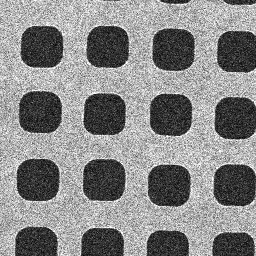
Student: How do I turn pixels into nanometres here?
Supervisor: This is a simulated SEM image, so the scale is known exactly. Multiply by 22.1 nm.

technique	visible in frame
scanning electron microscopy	a regular array of holes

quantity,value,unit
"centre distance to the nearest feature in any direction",1440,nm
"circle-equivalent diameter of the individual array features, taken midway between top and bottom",999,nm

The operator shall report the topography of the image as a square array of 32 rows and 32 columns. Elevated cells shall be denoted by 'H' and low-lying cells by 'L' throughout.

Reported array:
HHHHHHHHHHHHHHHHHHHHHLLHHHHHHLLL
HHHHHHHHHHHHHHHHHHHHHHHHHHHHHHHH
HHHHHHHHHHHHHHHHHHHHHHHHHHHHHHHH
HHHHLLLHHHHHLLLHHHHHHHHHHHHHHHHH
HHHLLLLLHHHLLLLLHHHLLLLLHHHHLLLL
HHLLLLLLHHHLLLLLHHHLLLLLHHHLLLLL
HHHLLLLLHHHLLLLLHHHLLLLLHHHLLLLL
HHHLLLLLHHHLLLLLHHHLLLLLHHHLLLLL
HHHHHLHHHHHHHLHHHHHHLLLHHHHHLLLL
HHHHHHHHHHHHHHHHHHHHHHHHHHHHHHHH
HHHHHHHHHHHHHHHHHHHHHHHHHHHHHHHH
HHHHLLHHHHHHHHHHHHHHHHHHHHHHHHHH
HHHLLLLLHHHLLLLHHHHLLLLLHHHHLLLH
HHLLLLLLHHLLLLLLHHHLLLLLHHHLLLLL
HHLLLLLLHHLLLLLLHHHLLLLLHHHLLLLL
HHLLLLLHHHLLLLLLHHHLLLLLHHHLLLLL
HHHLLLLHHHHLLLLHHHHLLLLHHHHLLLLL
HHHHHHHHHHHHHHHHHHHHHHHHHHHHHHHH
HHHHHHHHHHHHHHHHHHHHHHHHHHHHHHHH
HHHHHHHHHHHHHHHHHHHHHHHHHHHHHHHH
HHHLLLLHHHHLLLLHHHHHHLHHHHHHHLHH
HHLLLLLHHHLLLLLLHHHLLLLLHHHLLLLL
HHLLLLLLHHLLLLLLHHLLLLLLHHHLLLLL
HHLLLLLHHHLLLLLLHHLLLLLLHHHLLLLL
HHHLLLLHHHHLLLLHHHHLLLLLHHHLLLLL
HHHHHHHHHHHHHHHHHHHLLLLHHHHHLLLH
HHHHHHHHHHHHHHHHHHHHHHHHHHHHHHHH
HHHHHHHHHHHHHHHHHHHHHHHHHHHHHHHH
HHHLLLHHHHHHLLHHHHHHHHHHHHHHHHHH
HHLLLLLHHHLLLLLHHHHLLLLHHHHLLLLH
HHLLLLLHHHLLLLLLHHLLLLLLHHHLLLLL
HHLLLLLHHHLLLLLLHHLLLLLLHHLLLLLL